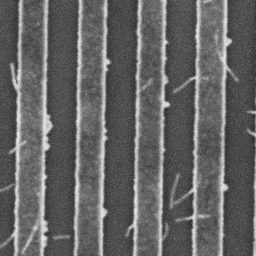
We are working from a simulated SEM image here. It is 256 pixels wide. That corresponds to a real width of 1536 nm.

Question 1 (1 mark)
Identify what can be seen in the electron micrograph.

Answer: lines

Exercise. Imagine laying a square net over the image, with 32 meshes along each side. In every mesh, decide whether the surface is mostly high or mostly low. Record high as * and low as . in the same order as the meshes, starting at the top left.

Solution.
...***....***....****....***....
..****....***....****....***....
..****....***....****....***....
..****....***....****....***....
..****....***....****....***....
..****....***....****....***....
..****....***....****....***....
..****....***....***.....***....
..****....***....***.....***....
..****....***....***....****....
..****....***....***.....***....
..****....***....***.....***....
..****....***....***....****....
..****....***....***....****....
..****....***....***.....***....
..****....***....***....****....
..****....***....***....****....
..****....***....***....****....
..****....***....***....****....
..***.....***....***....****....
..***.....***....***....****....
..***.....***....***....****....
..***....****....***....****....
..***....****....***....****....
..***....****....***....****....
..***....****....***....****....
..***....****....***....****....
..***....****....***....****....
..***....****....***....****....
..***....****....***....****....
..***....****....***....****....
..***....****....***....****....